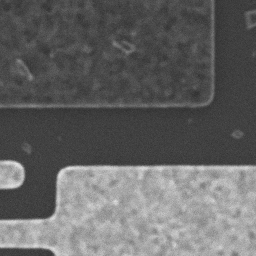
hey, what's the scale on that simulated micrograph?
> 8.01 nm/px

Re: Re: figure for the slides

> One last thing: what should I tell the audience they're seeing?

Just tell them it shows wiring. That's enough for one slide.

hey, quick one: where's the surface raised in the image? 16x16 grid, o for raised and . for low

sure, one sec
ooooooooooooo...
ooooooooooooo...
ooooooooooooo...
ooooooooooooo...
ooooooooooooo...
ooooooooooooo...
ooooooooooooo...
................
................
................
o...oooooooooooo
o...oooooooooooo
....oooooooooooo
...ooooooooooooo
oooooooooooooooo
..oooooooooooooo